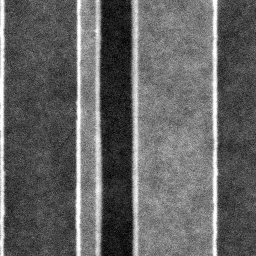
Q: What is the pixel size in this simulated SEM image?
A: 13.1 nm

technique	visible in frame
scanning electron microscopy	lines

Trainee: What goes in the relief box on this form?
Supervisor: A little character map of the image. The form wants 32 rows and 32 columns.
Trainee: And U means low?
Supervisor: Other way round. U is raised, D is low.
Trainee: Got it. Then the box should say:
DDDDDDDDDDUUDDDDDUUUUUUUUUUDDDDD
DDDDDDDDDDUUDDDDDUUUUUUUUUUDDDDD
DDDDDDDDDDUUDDDDDUUUUUUUUUUDDDDD
DDDDDDDDDDUUDDDDDUUUUUUUUUUDDDDD
DDDDDDDDDDUUDDDDDUUUUUUUUUUDDDDD
DDDDDDDDDDUUDDDDDUUUUUUUUUUDDDDD
DDDDDDDDDDUUDDDDDUUUUUUUUUUDDDDD
DDDDDDDDDDUUDDDDDUUUUUUUUUUDDDDD
DDDDDDDDDDUUDDDDDUUUUUUUUUUDDDDD
DDDDDDDDDDUUDDDDDUUUUUUUUUUDDDDD
DDDDDDDDDDUUDDDDDUUUUUUUUUUDDDDD
DDDDDDDDDDUUDDDDDUUUUUUUUUUDDDDD
DDDDDDDDDDUUDDDDDUUUUUUUUUUDDDDD
DDDDDDDDDDUUDDDDDUUUUUUUUUUDDDDD
DDDDDDDDDDUUDDDDDUUUUUUUUUUDDDDD
DDDDDDDDDDUUDDDDDUUUUUUUUUUDDDDD
DDDDDDDDDDUUDDDDDUUUUUUUUUUDDDDD
DDDDDDDDDDUUDDDDDUUUUUUUUUUDDDDD
DDDDDDDDDDUUDDDDDUUUUUUUUUUDDDDD
DDDDDDDDDDUUDDDDDUUUUUUUUUUDDDDD
DDDDDDDDDDUUDDDDDUUUUUUUUUUDDDDD
DDDDDDDDDDUUDDDDDUUUUUUUUUUDDDDD
DDDDDDDDDDUUDDDDDUUUUUUUUUUDDDDD
DDDDDDDDDDUUDDDDDUUUUUUUUUUDDDDD
DDDDDDDDDDUUDDDDDUUUUUUUUUUDDDDD
DDDDDDDDDDUUDDDDDUUUUUUUUUUDDDDD
DDDDDDDDDDUUDDDDDUUUUUUUUUUDDDDD
DDDDDDDDDDUUDDDDDUUUUUUUUUUDDDDD
DDDDDDDDDDUUDDDDDUUUUUUUUUUDDDDD
DDDDDDDDDDUUDDDDDUUUUUUUUUUDDDDD
DDDDDDDDDDUUDDDDDUUUUUUUUUUDDDDD
DDDDDDDDDDUUDDDDDUUUUUUUUUUDDDDD